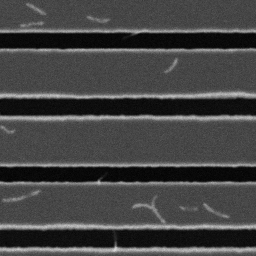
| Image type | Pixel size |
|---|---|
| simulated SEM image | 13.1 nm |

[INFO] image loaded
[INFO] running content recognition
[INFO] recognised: lines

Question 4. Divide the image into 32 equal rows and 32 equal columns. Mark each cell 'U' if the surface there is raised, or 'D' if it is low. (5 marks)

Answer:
UUUUUUUUUUUUUUUUUUUUUUUUUUUUUUUU
UUUUUUUUUUUUUUUUUUUUUUUUUUUUUUUU
UUUUUUUUUUUUUUUUUUUUUUUUUUUUUUUU
UUUUUUUUUUUUUUUUUUUUUUUUUUUUUUUU
DDDDDDDDDDDDDDDDDDDDDDDDDDDDDDDD
DDDDDDDDDDDDDDDDDDDDDDDDDDDDDDDD
UUUUUUUUUUUUUUUUUUUUUUUUUUUUUUUU
UUUUUUUUUUUUUUUUUUUUUUUUUUUUUUUU
UUUUUUUUUUUUUUUUUUUUUUUUUUUUUUUU
UUUUUUUUUUUUUUUUUUUUUUUUUUUUUUUU
UUUUUUUUUUUUUUUUUUUUUUUUUUUUUUUU
UUUUUUUUUUUUUUUUUUUUUUUUUUUUUUUU
DDDDDDDDDDDDDDDDDDDDDDDDDDDDDDDD
DDDDDDDDDDDDDDDDDDDDDDDDDDDDDDDD
DDDDDDDDDDDUDDDDDDUDDDDDDDDDDDDD
UUUUUUUUUUUUUUUUUUUUUUUUUUUUUUUU
UUUUUUUUUUUUUUUUUUUUUUUUUUUUUUUU
UUUUUUUUUUUUUUUUUUUUUUUUUUUUUUUU
UUUUUUUUUUUUUUUUUUUUUUUUUUUUUUUU
UUUUUUUUUUUUUUUUUUUUUUUUUUUUUUUU
UUUUUUUUUUUUUUUUUUUUUUUUUUUUUUUU
DDDDDDDDDDDDDDDDDDDDDDDDDDDDDDDD
DDDDDDDDDDDDDDDDDDDDDDDDDDDDDDDD
UUUUUUUUUUUUUUUUUUUUUUUUUUUUUUUU
UUUUUUUUUUUUUUUUUUUUUUUUUUUUUUUU
UUUUUUUUUUUUUUUUUUUUUUUUUUUUUUUU
UUUUUUUUUUUUUUUUUUUUUUUUUUUUUUUU
UUUUUUUUUUUUUUUUUUUUUUUUUUUUUUUU
UUUUUUUUUUUUUUUUUUUUUUUUUUUUUUUU
DDDDDDDDDDDDDDDDDDDDDDDDDDDDDDDD
DDDDDDDDDDDDDDDDDDDDDDDDDDDDDDDD
UUUUUUUUUUUUUUUUUUUUUUUUUUUUUUUU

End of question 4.